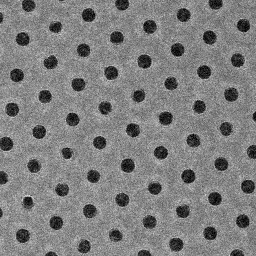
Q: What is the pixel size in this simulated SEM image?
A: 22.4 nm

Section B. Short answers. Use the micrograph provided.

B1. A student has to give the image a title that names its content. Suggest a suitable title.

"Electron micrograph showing a regular array of holes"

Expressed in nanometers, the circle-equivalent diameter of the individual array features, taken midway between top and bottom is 330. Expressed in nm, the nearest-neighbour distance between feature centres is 774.